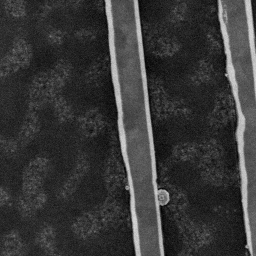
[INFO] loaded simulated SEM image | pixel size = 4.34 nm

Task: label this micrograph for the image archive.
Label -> one or a few lines or trenches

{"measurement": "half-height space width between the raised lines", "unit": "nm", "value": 379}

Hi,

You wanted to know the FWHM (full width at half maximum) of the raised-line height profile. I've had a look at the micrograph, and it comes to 120 nm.